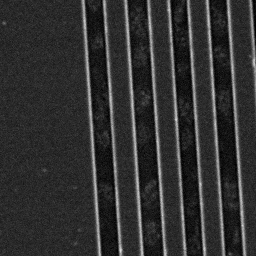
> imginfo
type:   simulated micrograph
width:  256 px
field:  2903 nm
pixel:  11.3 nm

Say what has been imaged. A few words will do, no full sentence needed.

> parallel lines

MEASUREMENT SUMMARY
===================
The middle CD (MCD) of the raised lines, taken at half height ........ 258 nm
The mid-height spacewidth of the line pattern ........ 224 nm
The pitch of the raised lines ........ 41.3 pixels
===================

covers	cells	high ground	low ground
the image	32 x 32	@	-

@@@@@@@@@@---@@@--@@@--@@@---@@-
@@@@@@@@@@@--@@@---@@--@@@---@@-
@@@@@@@@@@@--@@@---@@---@@---@@@
@@@@@@@@@@@--@@@---@@---@@---@@@
@@@@@@@@@@@--@@@---@@@--@@---@@@
@@@@@@@@@@@--@@@---@@@--@@---@@@
@@@@@@@@@@@--@@@---@@@--@@---@@@
@@@@@@@@@@@--@@@---@@@--@@@--@@@
@@@@@@@@@@@---@@---@@@--@@@--@@@
@@@@@@@@@@@---@@---@@@--@@@--@@@
@@@@@@@@@@@---@@---@@@--@@@--@@@
@@@@@@@@@@@---@@@--@@@--@@@--@@@
@@@@@@@@@@@---@@@--@@@--@@@--@@@
@@@@@@@@@@@---@@@--@@@--@@@--@@@
@@@@@@@@@@@---@@@--@@@--@@@--@@@
@@@@@@@@@@@---@@@--@@@--@@@--@@@
@@@@@@@@@@@@--@@@---@@--@@@---@@
@@@@@@@@@@@@--@@@---@@---@@---@@
@@@@@@@@@@@@--@@@---@@---@@---@@
@@@@@@@@@@@@--@@@---@@---@@---@@
@@@@@@@@@@@@--@@@---@@@--@@---@@
@@@@@@@@@@@@--@@@---@@@--@@---@@
@@@@@@@@@@@@--@@@---@@@--@@@--@@
@@@@@@@@@@@@---@@---@@@--@@@--@@
@@@@@@@@@@@@---@@---@@@--@@@--@@
@@@@@@@@@@@@---@@---@@@--@@@--@@
@@@@@@@@@@@@---@@---@@@--@@@--@@
@@@@@@@@@@@@---@@@--@@@--@@@--@@
@@@@@@@@@@@@---@@@--@@@--@@@--@@
@@@@@@@@@@@@---@@@--@@@--@@@--@@
@@@@@@@@@@@@---@@@--@@@--@@@--@@
@@@@@@@@@@@@---@@@--@@@--@@@---@